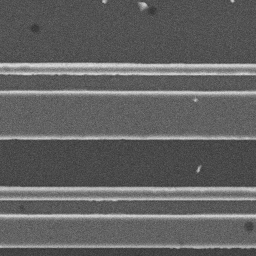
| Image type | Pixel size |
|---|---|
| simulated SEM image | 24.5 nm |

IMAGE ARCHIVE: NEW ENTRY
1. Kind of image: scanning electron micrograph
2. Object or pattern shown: lines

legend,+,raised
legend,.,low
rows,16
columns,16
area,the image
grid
................
................
................
................
++++++++++++++++
++++++++++++++++
++++++++++++++++
++++++++++++++++
++++++++++++++++
................
................
................
++++++++++++++++
++++++++++++++++
++++++++++++++++
................